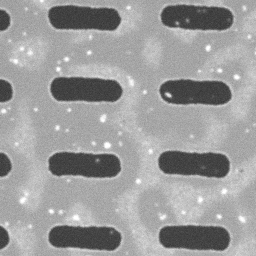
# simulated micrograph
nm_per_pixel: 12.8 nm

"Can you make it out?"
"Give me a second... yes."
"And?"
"a regular array of holes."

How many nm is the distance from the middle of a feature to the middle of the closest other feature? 926